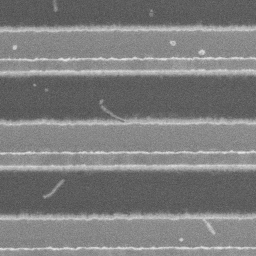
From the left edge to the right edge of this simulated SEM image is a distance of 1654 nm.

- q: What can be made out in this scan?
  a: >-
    lines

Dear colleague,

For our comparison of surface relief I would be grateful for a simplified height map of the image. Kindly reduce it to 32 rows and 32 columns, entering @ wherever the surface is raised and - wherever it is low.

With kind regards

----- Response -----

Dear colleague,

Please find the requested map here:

--------------------------------
--------------------------------
--------------------------------
--------------------------------
@@@@@@@@@@@@@@@@@@@@@@@@@@@@@@@@
@@@@@@@@@@@@@@@@@@@@@@@@@@@@@@@@
@@@@@@@@@@@@@@@@@@@@@@@@@@@@@@@@
@@@@@@@@@@@@@@@@@@@@@@@@@@@@@@@@
@@@@@@@@@@@@@@@@@@@@@@@@@@@@@@@@
--------------------------------
--------------------------------
--------------------------------
--------------------------------
--------------------------------
--------------------------------
----@@@----@@--@@@@@@@@@@@@@@@@@
@@@@@@@@@@@@@@@@@@@@@@@@@@@@@@@@
@@@@@@@@@@@@@@@@@@@@@@@@@@@@@@@@
@@@@@@@@@@@@@@@@@@@@@@@@@@@@@@@@
@@@@@@@@@@@@@@@@@@@@@@@@@@@@@@@@
@@@@@@@@@@@@@@@@@@@@@@@@@@@@@@@@
--------------------------------
--------------------------------
--------------------------------
--------------------------------
--------------------------------
--------------------------------
@@@@@@@@@@@@@@@@@@@@@@@@@@@@@@@@
@@@@@@@@@@@@@@@@@@@@@@@@@@@@@@@@
@@@@@@@@@@@@@@@@@@@@@@@@@@@@@@@@
@@@@@@@@@@@@@@@@@@@@@@@@@@@@@@@@
@@@@@@@@@@@@@@@@@@@@@@@@@@@@@@@@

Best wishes